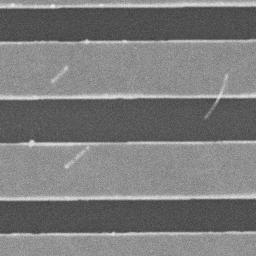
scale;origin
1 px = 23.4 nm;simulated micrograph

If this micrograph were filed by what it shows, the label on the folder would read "lines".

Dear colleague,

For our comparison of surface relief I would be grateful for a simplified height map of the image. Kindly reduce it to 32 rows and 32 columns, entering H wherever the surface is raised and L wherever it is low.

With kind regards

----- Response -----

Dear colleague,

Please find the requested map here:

HHHHHHHHHHHHHHHHHHHHHHHHHHHHHHHH
LLLLLLLLLLLLLLLLLLLLLLLLLLLLLLLL
LLLLLLLLLLLLLLLLLLLLLLLLLLLLLLLL
LLLLLLLLLLLLLLLLLLLLLLLLLLLLLLLL
LLLLLLLLLLLLLLLLLLLLLLLLLLLLLLLL
HHHHHHHHHHHHHHHHHHHHHHHHHHHHHHHH
HHHHHHHHHHHHHHHHHHHHHHHHHHHHHHHH
HHHHHHHHHHHHHHHHHHHHHHHHHHHHHHHH
HHHHHHHHHHHHHHHHHHHHHHHHHHHHHHHH
HHHHHHHHHHHHHHHHHHHHHHHHHHHHHHHH
HHHHHHHHHHHHHHHHHHHHHHHHHHHHHHHH
HHHHHHHHHHHHHHHHHHHHHHHHHHHHHHHH
LLLLLLLLLLLLLLLLLLLLLLLLLLLLLLLL
LLLLLLLLLLLLLLLLLLLLLLLLLLLLLLLL
LLLLLLLLLLLLLLLLLLLLLLLLLLLLLLLL
LLLLLLLLLLLLLLLLLLLLLLLLLLLLLLLL
LLLLLLLLLLLLLLLLLLLLLLLLLLLLLLLL
LLLLLLLLLLLLLLLLLLLLLLLLLLLLLLLL
HHHHHHHHHHHHHHHHHHHHHHHHHHHHHHHH
HHHHHHHHHHHHHHHHHHHHHHHHHHHHHHHH
HHHHHHHHHHHHHHHHHHHHHHHHHHHHHHHH
HHHHHHHHHHHHHHHHHHHHHHHHHHHHHHHH
HHHHHHHHHHHHHHHHHHHHHHHHHHHHHHHH
HHHHHHHHHHHHHHHHHHHHHHHHHHHHHHHH
HHHHHHHHHHHHHHHHHHHHHHHHHHHHHHHH
LLLLLLLLLLLLLLLLLLLLLLLLLLLLLLLL
LLLLLLLLLLLLLLLLLLLLLLLLLLLLLLLL
LLLLLLLLLLLLLLLLLLLLLLLLLLLLLLLL
LLLLLLLLLLLLLLLLLLLLLLLLLLLLLLLL
HHHHHHHHHHHHHHHHHHHHHHHHHHHHHHHH
HHHHHHHHHHHHHHHHHHHHHHHHHHHHHHHH
HHHHHHHHHHHHHHHHHHHHHHHHHHHHHHHH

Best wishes